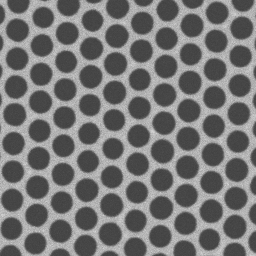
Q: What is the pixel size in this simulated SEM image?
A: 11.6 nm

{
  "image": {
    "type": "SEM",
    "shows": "a regular array of holes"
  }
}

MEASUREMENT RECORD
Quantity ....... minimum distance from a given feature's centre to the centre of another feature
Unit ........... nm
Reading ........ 325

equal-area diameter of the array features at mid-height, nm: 272